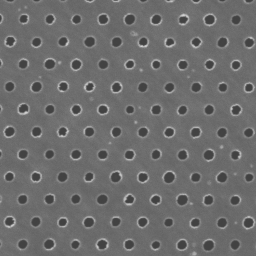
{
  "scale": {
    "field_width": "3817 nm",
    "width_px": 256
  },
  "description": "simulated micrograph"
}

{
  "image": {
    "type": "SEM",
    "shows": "a regular array of holes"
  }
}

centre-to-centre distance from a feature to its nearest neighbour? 0.385 micrometres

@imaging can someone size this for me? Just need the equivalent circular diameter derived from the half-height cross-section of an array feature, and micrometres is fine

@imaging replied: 0.138